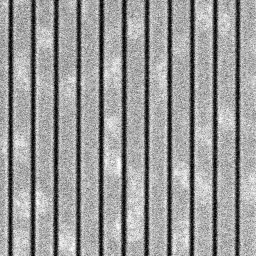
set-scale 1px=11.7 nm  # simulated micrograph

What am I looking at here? parallel lines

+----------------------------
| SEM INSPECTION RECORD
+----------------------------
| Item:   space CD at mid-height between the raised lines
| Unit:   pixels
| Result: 5.75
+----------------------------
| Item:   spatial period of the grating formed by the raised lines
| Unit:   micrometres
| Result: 0.266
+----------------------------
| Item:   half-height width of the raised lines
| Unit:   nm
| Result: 205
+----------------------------